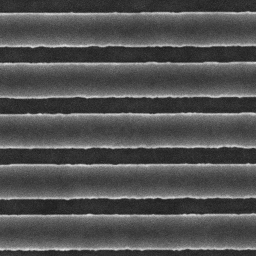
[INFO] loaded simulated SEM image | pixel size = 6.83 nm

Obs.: lines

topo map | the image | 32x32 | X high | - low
--------------------------------
------------------------------X-
XXXXXXXXXXXXXXXXXXXXXXXXXXXXXXXX
XXXXXXXXXXXXXXXXXXXXXXXXXXXXXXXX
XXXXXXXXXXXXXXXXXXXXXXXXXXXXXXXX
XXXXXXXXXXXXXXXXXXXXXXXXXXXXXXXX
--------------------------------
--------------------------------
XXXXXXXXXXXXXXXXXXXXXXXXXXXXXXXX
XXXXXXXXXXXXXXXXXXXXXXXXXXXXXXXX
XXXXXXXXXXXXXXXXXXXXXXXXXXXXXXXX
XXXXXXXXXXXXXXXXXXXXXXXXXXXXXXXX
--------------------------------
--------------------------------
XXXXXXXXXXXXXXXXXXXXXXXXXXXXXXXX
XXXXXXXXXXXXXXXXXXXXXXXXXXXXXXXX
XXXXXXXXXXXXXXXXXXXXXXXXXXXXXXXX
XXXXXXXXXXXXXXXXXXXXXXXXXXXXXXXX
--------------------------------
--------------------------------
------------------------X-X----X
XXXXXXXXXXXXXXXXXXXXXXXXXXXXXXXX
XXXXXXXXXXXXXXXXXXXXXXXXXXXXXXXX
XXXXXXXXXXXXXXXXXXXXXXXXXXXXXXXX
XXXXXXXXXXXXXXXXXXXXXXXXXXXXXXXX
--------------------------------
--------------------------------
XXXXXXXXXXXXXXXXXXXXXXXXXXXXXXXX
XXXXXXXXXXXXXXXXXXXXXXXXXXXXXXXX
XXXXXXXXXXXXXXXXXXXXXXXXXXXXXXXX
XXXXXXXXXXXXXXXXXXXXXXXXXXXXXXXX
--------------------------------